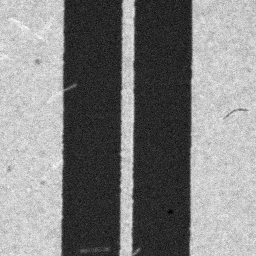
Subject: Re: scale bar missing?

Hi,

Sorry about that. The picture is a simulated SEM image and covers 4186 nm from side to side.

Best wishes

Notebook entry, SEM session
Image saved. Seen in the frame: lines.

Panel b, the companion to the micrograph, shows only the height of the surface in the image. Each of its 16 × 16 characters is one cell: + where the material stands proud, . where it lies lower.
++++........++++
++++........++++
++++........++++
++++........++++
++++........++++
++++........++++
++++........++++
++++........++++
++++........++++
++++........++++
++++........++++
++++........++++
++++........++++
++++........++++
++++........++++
++++........++++